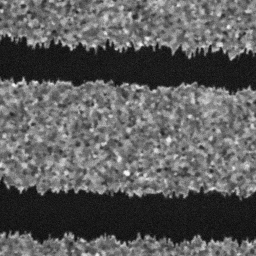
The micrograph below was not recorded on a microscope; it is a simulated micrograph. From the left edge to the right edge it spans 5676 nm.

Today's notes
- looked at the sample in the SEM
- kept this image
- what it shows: one or a few lines or trenches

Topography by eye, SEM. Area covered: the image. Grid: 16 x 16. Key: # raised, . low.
################
################
.###############
................
................
#########.###...
################
################
################
################
################
.###############
................
................
................
################